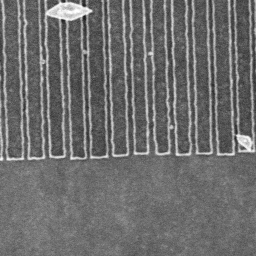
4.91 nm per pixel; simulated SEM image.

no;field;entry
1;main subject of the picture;parallel lines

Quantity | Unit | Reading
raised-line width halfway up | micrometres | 0.0735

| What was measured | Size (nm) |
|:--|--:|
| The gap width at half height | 27.6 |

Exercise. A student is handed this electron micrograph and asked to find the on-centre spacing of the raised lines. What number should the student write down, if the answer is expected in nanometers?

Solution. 103